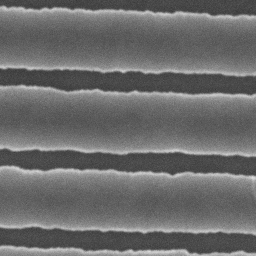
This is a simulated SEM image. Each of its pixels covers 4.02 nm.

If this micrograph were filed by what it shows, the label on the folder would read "lines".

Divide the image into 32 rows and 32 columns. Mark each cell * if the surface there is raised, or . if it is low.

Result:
................................
*****************.*.............
********************************
********************************
********************************
********************************
********************************
********************************
...*****************************
................................
................................
*************...................
********************************
********************************
********************************
********************************
********************************
********************************
.*******************************
...............................*
................................
***************..**.............
********************************
********************************
********************************
********************************
********************************
********************************
..*..***************************
................................
................................
***********************......*..